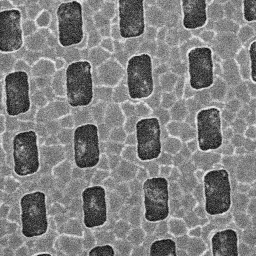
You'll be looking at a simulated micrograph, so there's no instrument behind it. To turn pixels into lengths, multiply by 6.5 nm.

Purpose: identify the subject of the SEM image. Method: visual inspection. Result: a regular array of holes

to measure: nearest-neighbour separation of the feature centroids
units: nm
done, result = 397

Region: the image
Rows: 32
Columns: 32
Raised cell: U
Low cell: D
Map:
UUUUUUUUDDUUUUUDDDUUUUUDDDUUUUDD
DDUUUUUDDDUUUUUDDDUUUUUDDDUUUUDD
DDDUUUUDDDUUUUUDDDUUUUUDDDUUUUUD
DDDUUUUDDDUUUUUDDDUUUUUDDUUUUUUU
DDDUUUUDDDUUUUUDDUUUUUUUUUUUUUUU
DDDUUUUUDUUUUUUUUUUUUUUUUUUUUUUD
DUUUUUUUUUUUUUUUUUUUUUUUDDUUUUUD
UUUUUUUUUUUUUUUUDDDUUUUUDDDUUUUD
UUUUUUUUDDDUUUUUDDDUUUUUDDDUUUUD
UDDUUUUUDDDUUUUUDDDUUUUUDDDUUUUD
UDDDUUUUDDDDUUUUDDDUUUUUDDUUUUUU
UDDDUUUUDDDDUUUUDDDUUUUUUUUUUUUU
UDDDUUUUDDDUUUUUUUUUUUUUUUUUUUUU
UDDDUUUUUUUUUUUUUUUUUUUUUUDUUUUU
UUUUUUUUUUUUUUUUUUUUUUUUUDDDUUUU
UUUUUUUUUUUUUUUUUDDDUUUUDDDDUUUU
UUUDUUUUUDDDUUUUUDDDUUUUUDDDUUUU
UUDDDUUUUDDDUUUUUDDDUUUUUDDDUUUU
UUDDDUUUUDDDUUUUUDDDUUUUUDDUUUUU
UUDDDUUUUDDDUUUUUDDDUUUUUUUUUUUU
UUDDDUUUUUDDUUUUUUUUUUUUUUUUUUUU
UUDDUUUUUUUUUUUUUUUUUUUUUUDDUUUU
UUUUUUUUUUUUUUUUUUDDDUUUUDDDDUUU
UUUUUUUUUUUDDUUUUUDDDUUUUUDDDUUU
UUUDDDUUUUDDDUUUUUDDDUUUUUDDDUUU
UUUDDDUUUUDDDUUUUUDDDUUUUUDDDUUU
UUUDDDUUUUDDDUUUUUDDDUUUUUDDUUUU
UUUDDDUUUUDDDUUUUUUDUUUUUUUUUUUU
UUUDDDUUUUUDUUUUUUUUUUUUUUUUUUUU
UUUDDUUUUUUUUUUUUUUUUUUUUUUDDDUU
UUUUUUUUUUUUUUUUUUUDDDUUUUDDDDUU
UUUUUUUUUUUDDDUUUUUDDDUUUUDDDDUU